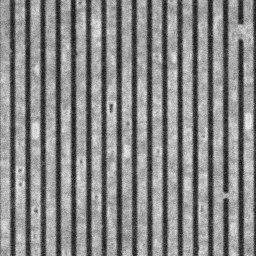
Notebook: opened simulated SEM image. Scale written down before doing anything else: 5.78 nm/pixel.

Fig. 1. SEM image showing parallel lines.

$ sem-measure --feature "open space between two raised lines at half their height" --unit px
5.38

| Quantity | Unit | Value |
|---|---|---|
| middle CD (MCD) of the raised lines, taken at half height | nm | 57.1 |